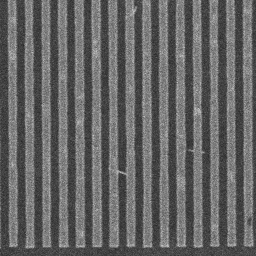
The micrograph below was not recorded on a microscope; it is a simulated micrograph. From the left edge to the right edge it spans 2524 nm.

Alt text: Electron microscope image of parallel lines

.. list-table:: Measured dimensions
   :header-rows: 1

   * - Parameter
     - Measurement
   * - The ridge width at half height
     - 76.4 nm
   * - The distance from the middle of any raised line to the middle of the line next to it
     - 166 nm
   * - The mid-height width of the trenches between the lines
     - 9.38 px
